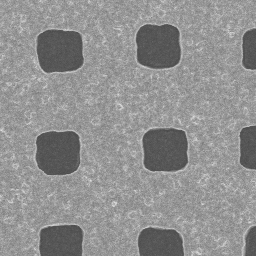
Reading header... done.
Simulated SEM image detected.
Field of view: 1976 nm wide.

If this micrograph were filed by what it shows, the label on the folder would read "holes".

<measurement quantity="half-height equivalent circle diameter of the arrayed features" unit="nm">367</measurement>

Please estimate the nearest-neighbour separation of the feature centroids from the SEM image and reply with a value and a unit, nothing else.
774 nanometers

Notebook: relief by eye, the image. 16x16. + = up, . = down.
++++++++++++++++
++++++++++++++++
++...++++..++++.
++...++++..++++.
++++++++++++++++
++++++++++++++++
++++++++++++++++
++++++++++++++++
+++..++++...+++.
++...++++...+++.
+++..++++..++++.
++++++++++++++++
++++++++++++++++
++++++++++++++++
+++..++++..+++++
++...++++..++++.